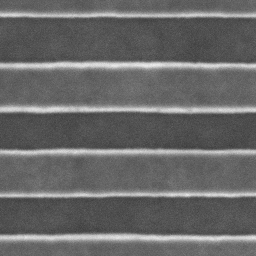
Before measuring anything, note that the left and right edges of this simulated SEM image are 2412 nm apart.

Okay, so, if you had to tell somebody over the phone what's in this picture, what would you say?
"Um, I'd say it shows lines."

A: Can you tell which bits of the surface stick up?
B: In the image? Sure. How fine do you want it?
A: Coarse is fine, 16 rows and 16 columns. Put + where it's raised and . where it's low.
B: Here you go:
++++++++++++++++
................
................
................
++++++++++++++++
++++++++++++++++
++++++++++++++++
................
................
................
++++++++++++++++
++++++++++++++++
................
................
................
++++++++++++++++